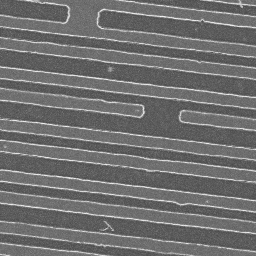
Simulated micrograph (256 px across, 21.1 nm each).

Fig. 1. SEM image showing parallel lines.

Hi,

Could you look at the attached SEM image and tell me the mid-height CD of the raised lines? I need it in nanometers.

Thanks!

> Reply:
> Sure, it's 240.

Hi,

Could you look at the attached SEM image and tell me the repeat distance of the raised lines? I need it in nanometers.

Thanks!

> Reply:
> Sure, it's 542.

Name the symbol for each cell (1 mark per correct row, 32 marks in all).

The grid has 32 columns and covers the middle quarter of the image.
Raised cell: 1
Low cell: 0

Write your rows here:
00000000000000000000011111111111
00000000000000000000000000000011
00000000000000000000000000000000
11111110000000000000000000000000
11111111111111000000000000000000
01111111111111111111111000000000
00000000001111111111111111111111
00000000000000000011111111111111
11100000000000000000000000111111
11111111111000000000000000000000
11111111111111111111000000000000
00000011111111111111000000000000
00000000000000111111000000000111
00000000000000000000000000000111
00000000000000000000000000000001
00000000000000000000000000000000
11111100000000000000000000000000
11111111111111110000000000000000
00111111111111111111111110000000
00000000000111111111111111111111
00000000000000000011111111111111
11110000000000000000000000011111
11111111111100000000000000000000
11111111111111111110000000000000
00000111111111111111111111101000
00000000000000011111111111111111
00000000000000000000011111111111
00000000000000000000000000000010
10000000000000000000000000000000
11111111100000000000000000000000
11111111111111111000000000000000
00011111111111111111111111000000